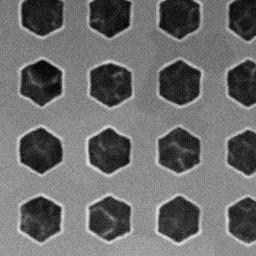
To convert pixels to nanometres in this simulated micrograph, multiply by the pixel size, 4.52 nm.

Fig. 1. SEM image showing a regular array of holes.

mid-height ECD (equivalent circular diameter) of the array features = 0.203 microns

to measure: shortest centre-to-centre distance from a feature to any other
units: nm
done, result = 306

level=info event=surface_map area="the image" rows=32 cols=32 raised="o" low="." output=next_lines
ooo.....ooo.....oooo.....oooo...
oo......ooo.....oooo.....oooo...
ooo.....ooo.....oooo.....oooo...
ooo.....ooo.....oooo.....oooo...
ooooo.ooooooo.ooooooo..ooooooo..
oooooooooooooooooooooooooooooooo
oooooooooooooooooooooooooooooooo
ooooo.oooooooooooooooo.ooooooooo
ooo....ooooo....oooo.....oooo...
ooo.....ooo......ooo.....ooo....
oo......ooo......ooo.....ooo....
ooo.....ooo......ooo.....ooo....
oooo...ooooo....ooooo...ooooo...
oooooooooooooooooooooooooooooooo
oooooooooooooooooooooooooooooooo
oooooooooooooooooooooooooooooooo
oooo..oooooo...oooooo...oooooo..
oo.....oooo.....oooo.....oooo...
oo......ooo.....oooo.....ooo....
oo......ooo.....oooo.....ooo....
ooo....oooo.....oooo.....oooo...
oooo..ooooooo.oooooooo.ooooooo..
oooooooooooooooooooooooooooooooo
oooooooooooooooooooooooooooooooo
ooooooooooooo.oooooooo.ooooooooo
ooo....ooooo....oooo....ooooo...
oo......ooo.....oooo.....ooo....
oo......ooo.....oooo.....ooo....
oo......ooo.....oooo.....ooo....
ooo....ooooo...oooooo...ooooo...
oooooooooooooooooooooooooooooooo
oooooooooooooooooooooooooooooooo